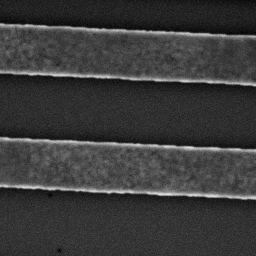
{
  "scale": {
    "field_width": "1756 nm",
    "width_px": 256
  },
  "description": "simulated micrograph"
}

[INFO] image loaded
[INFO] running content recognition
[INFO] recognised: lines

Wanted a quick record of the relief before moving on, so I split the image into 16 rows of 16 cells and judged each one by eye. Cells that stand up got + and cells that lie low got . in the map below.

................
................
++++++++++++++++
++++++++++++++++
++++++++++++++++
................
................
................
................
++++++++++++++++
++++++++++++++++
++++++++++++++++
................
................
................
................